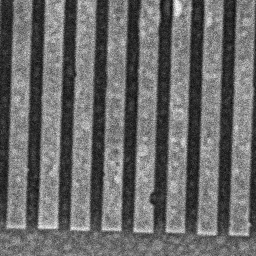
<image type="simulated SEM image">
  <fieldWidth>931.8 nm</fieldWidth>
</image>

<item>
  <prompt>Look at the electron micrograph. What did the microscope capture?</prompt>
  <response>parallel lines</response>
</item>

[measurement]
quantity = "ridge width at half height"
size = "68.2 nm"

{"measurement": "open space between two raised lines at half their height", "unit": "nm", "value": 49.6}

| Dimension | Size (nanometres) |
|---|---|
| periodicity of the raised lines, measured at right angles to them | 116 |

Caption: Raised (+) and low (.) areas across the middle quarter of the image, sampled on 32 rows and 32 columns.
...++++....++++....++++....++++.
...++++....++++....++++....++++.
...++++....++++....++++....++++.
...++++....++++....++++....++++.
...++++....++++....++++....++++.
...++++....++++....++++....++++.
...++++....++++....++++....++++.
...++++....++++....++++....++++.
...++++....++++....++++....++++.
...++++....++++....++++....++++.
...++++....++++....++++....++++.
...++++....++++....++++....++++.
...++++....++++...+++++....++++.
...++++....++++...+++++....++++.
...++++....++++...+++++...+++++.
...++++...+++++...+++++...+++++.
...++++...+++++...+++++...+++++.
...++++...+++++...+++++...+++++.
...++++...+++++...+++++...+++++.
..+++++...+++++...+++++...+++++.
..+++++...+++++...+++++...+++++.
..+++++...+++++...+++++...+++++.
..+++++...+++++...+++++...+++++.
..+++++...+++++...+++++...+++++.
..+++++...+++++...+++++...++++..
..+++++...+++++...+++++...++++..
..+++++...+++++...+++++...++++..
..++++....++++....++++....++++..
..++++....+++++...++++....++++..
..++++....+++++...++++....++++..
..++++....+++++...++++....++++..
..++++....++++....++++....++++..